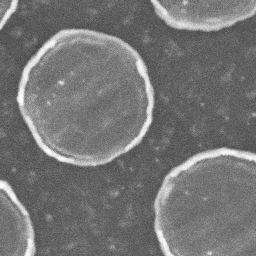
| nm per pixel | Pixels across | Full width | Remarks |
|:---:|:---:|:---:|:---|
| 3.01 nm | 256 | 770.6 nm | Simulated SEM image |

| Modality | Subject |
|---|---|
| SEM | raised bodies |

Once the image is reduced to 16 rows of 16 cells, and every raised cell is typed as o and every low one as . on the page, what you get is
o.........oooooo
...........ooo..
...ooooo........
..ooooooo.......
.oooooooo.......
.oooooooo.......
.ooooooooo......
..ooooooo.......
..ooooooo.......
...ooooo.....oo.
...........ooooo
..........oooooo
o.........oooooo
oo........oooooo
oo........oooooo
oo........oooooo